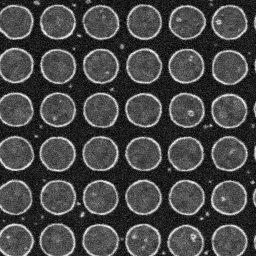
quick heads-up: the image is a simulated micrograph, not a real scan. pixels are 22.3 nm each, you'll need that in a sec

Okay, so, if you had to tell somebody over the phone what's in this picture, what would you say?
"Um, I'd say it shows a regular array of raised bodies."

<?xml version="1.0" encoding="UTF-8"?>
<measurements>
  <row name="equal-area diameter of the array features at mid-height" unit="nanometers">753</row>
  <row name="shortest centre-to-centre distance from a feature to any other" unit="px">42.7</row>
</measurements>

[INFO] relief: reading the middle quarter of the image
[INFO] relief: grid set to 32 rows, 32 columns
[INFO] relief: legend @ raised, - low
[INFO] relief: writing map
@@@--@@@@@@@@---@@@@@@@@--@@@@@@
@@@--@@@@@@@@---@@@@@@@@--@@@@@@
@@---@@@@@@@@---@@@@@@@@---@@@@@
@@----@@@@@@-----@@@@@@-----@@@@
--------@@----------@-----------
--------------------------------
--------------------------------
--------@@-------------------@@-
@@----@@@@@@-----@@@@@@-----@@@@
@@---@@@@@@@@---@@@@@@@@---@@@@@
@@@--@@@@@@@@---@@@@@@@@---@@@@@
@@@--@@@@@@@@---@@@@@@@@---@@@@@
@@@--@@@@@@@@---@@@@@@@@---@@@@@
@@----@@@@@@@---@@@@@@@@---@@@@@
@@----@@@@@@-----@@@@@@-----@@@@
--------@@@-------------------@@
--------------------------------
--------------------------------
-------@@@---------@----------@@
@-----@@@@@@-----@@@@@@-----@@@@
@@---@@@@@@@@---@@@@@@@@---@@@@@
@@@--@@@@@@@@---@@@@@@@@--@@@@@@
@@@--@@@@@@@@---@@@@@@@@--@@@@@@
@@---@@@@@@@@---@@@@@@@@--@@@@@@
@@---@@@@@@@@---@@@@@@@@---@@@@@
@-----@@@@@@-----@@@@@@-----@@@@
-----------------------------@--
--------------------------------
--------------------------------
--------@@--------@@@--------@@@
@@----@@@@@@-----@@@@@@-----@@@@
@@---@@@@@@@@---@@@@@@@@---@@@@@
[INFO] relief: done